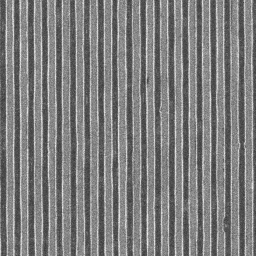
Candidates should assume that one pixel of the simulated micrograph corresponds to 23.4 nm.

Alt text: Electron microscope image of parallel lines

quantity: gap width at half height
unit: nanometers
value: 164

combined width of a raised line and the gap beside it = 329 nanometers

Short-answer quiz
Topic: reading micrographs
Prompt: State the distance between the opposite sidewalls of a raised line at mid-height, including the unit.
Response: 0.167 µm